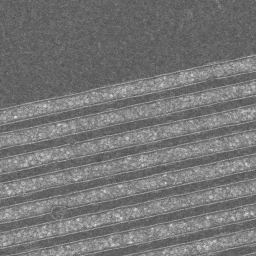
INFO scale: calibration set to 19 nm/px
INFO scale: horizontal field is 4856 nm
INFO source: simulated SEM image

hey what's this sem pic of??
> parallel lines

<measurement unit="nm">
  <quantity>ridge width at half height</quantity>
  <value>167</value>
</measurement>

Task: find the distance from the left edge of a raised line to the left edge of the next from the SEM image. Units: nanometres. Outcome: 457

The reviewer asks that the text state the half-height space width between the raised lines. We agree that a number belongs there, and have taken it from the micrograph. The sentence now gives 288 nm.